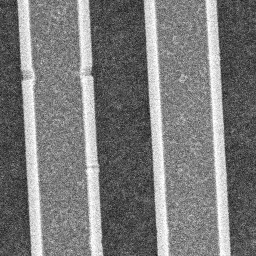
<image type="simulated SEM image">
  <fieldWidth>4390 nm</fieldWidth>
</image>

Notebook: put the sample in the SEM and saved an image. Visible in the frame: one or a few lines or trenches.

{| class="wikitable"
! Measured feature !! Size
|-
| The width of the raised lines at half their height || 1.04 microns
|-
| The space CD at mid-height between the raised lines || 1140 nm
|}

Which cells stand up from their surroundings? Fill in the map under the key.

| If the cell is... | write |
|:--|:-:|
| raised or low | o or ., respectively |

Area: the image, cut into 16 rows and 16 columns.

.oooo....oooo...
..ooo....oooo...
..ooo....oooo...
..ooo.....ooo...
..ooo.....ooo...
..ooo.....ooo...
..oooo....oooo..
..oooo....oooo..
..oooo....oooo..
..oooo....oooo..
..oooo....oooo..
..oooo....oooo..
..oooo....oooo..
..oooo....oooo..
..oooo....oooo..
..oooo....oooo..